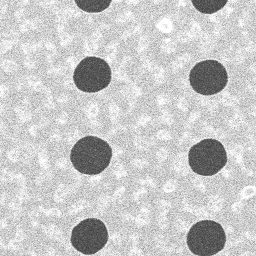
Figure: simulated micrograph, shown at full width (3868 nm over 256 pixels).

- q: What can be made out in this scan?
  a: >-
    holes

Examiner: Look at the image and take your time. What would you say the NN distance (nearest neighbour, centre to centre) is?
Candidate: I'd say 80.5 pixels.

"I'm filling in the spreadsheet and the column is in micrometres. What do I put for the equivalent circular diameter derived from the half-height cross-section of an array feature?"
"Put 0.569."